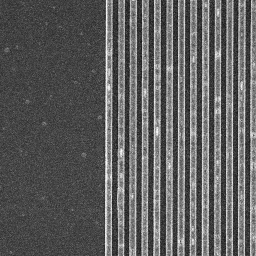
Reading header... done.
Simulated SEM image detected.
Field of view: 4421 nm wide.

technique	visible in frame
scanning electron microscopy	parallel lines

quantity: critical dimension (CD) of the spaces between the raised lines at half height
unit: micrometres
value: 0.106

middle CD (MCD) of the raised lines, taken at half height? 106 nm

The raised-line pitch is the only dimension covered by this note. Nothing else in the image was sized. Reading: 208 nm